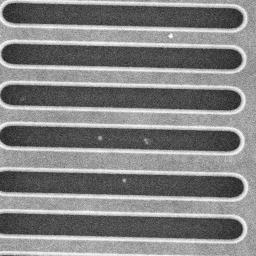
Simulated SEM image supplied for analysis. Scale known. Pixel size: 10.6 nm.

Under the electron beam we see groups of lines, slits or small figures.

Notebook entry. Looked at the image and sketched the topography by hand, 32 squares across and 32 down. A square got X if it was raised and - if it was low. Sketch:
X-----------------XXXXXXXXXXXXXX
------------------------------XX
-------------------------------X
XXXXXXXXXXXXXXXX--------------XX
XXXXXXXXXXXXXXXXXXXXXXXXXXXXXXXX
X--------------XXXXXXXXXXXXXXXXX
------------------------------XX
------------------------------XX
XXXXXXXXX---------------------XX
XXXXXXXXXXXXXXXXXXXXXXXXXXXXXXXX
X-------XXXXXXXXXXXXXXXXXXXXXXXX
------------------------------XX
------------------------------XX
XXXXXX------------------------XX
XXXXXXXXXXXXXXXXXXXXXXXXXXXXXXXX
X----XXXXXXXXXXXXXXXXXXXXXXXXXXX
------------------------------XX
------------------------------XX
XXX---------------------------XX
XXXXXXXXXXXXXXXXXXXXXXXXXXXXXXXX
XXXXXXXXXXXXXXXXXXXXXXXXXXXXXXXX
------------------XXXXXXXXXXXXXX
------------------------------XX
-------------------------------X
XXXXXXXXX---------------------XX
XXXXXXXXXXXXXXXXXXXXXXXXXXXXXXXX
-----XXXXXXXXXXXXXXXXXXXXXXXXXXX
------------------------------XX
-------------------------------X
X-----------------------------XX
XXXXXXXXXXXXXXXXXXXXXXXXXXXXXXXX
XXXXXXXXXXXXXXXXXXXXXXXXXXXXXXXX